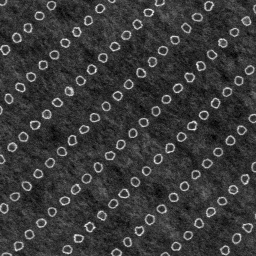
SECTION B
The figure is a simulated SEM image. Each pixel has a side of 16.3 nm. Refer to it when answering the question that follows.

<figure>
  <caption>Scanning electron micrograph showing a regular array of raised bodies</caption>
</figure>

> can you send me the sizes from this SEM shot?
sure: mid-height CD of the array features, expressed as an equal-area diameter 0.141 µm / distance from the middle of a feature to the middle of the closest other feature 256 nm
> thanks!